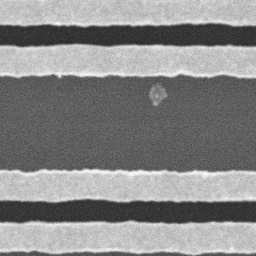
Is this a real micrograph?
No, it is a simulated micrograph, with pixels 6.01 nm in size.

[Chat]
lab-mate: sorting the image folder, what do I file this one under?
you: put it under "lines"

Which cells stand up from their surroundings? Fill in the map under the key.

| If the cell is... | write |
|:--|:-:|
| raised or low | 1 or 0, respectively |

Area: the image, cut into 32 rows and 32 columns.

11111111111111111111111111111111
11111111111111111111111111111111
11111111111111111111111111111111
00000000000000000000000000000000
00000000000000000000000000000000
00000000000000000000000000000000
11111111111111111111111111111111
11111111111111111111111111111111
11111111111111111111111111111111
00100000000010000000010011100111
00000000000000000000000000000000
00000000000000000000000000000000
00000000000000000000000000000000
00000000000000000000000000000000
00000000000000000000000000000000
00000000000000000000000000000000
00000000000000000000000000000000
00000000000000000000000000000000
00000000000000000000000000000000
00000000000000000000000000000000
00000000000000000000000000000000
11100111111111110100100000001110
11111111111111111111111111111111
11111111111111111111111111111111
11111111111111111111111111111111
00000000000000000000000000000000
00000000000000000000000000000000
00000000000000000000000000000000
11111111111111111111111111111111
11111111111111111111111111111111
11111111111111111111111111111111
00000011000000001110001111001111